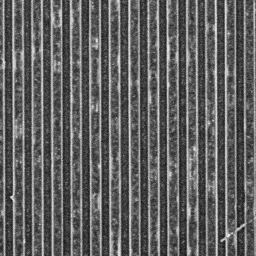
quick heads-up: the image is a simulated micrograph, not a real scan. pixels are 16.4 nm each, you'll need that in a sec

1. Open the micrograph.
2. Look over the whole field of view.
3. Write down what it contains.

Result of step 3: parallel lines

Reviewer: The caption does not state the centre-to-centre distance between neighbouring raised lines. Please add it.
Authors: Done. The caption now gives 317 nanometres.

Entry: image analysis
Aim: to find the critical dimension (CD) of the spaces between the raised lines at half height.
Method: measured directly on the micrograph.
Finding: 0.14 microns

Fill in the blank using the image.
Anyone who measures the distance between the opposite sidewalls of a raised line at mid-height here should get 171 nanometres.